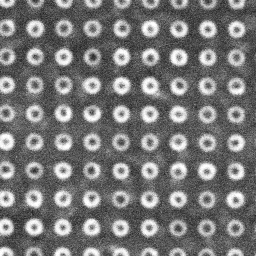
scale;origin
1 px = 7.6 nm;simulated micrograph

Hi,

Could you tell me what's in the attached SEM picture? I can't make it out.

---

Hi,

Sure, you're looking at a regular array of raised bodies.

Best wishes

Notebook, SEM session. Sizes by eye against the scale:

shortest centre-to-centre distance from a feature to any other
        214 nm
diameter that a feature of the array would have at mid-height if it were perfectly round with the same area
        105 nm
